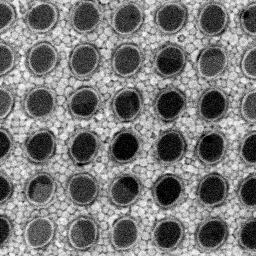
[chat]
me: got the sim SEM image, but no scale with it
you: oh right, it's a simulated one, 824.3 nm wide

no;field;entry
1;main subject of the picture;a regular array of raised bodies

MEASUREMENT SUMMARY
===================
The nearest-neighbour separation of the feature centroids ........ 135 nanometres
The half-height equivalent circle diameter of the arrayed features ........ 93.6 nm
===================